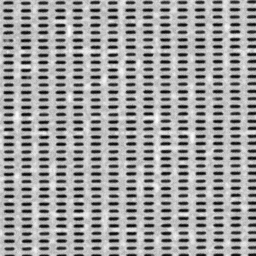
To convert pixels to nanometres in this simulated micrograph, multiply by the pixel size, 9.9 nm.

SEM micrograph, a regular array of holes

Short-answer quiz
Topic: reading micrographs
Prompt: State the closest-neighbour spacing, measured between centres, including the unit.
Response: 70 nm